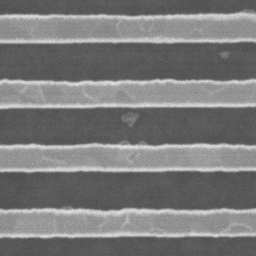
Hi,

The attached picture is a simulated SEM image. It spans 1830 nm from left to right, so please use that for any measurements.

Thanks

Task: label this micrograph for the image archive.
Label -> lines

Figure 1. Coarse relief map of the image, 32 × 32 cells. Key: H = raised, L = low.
LLLLLLLLLLLLLLLLLLLLLLLLLLLLLLLL
LLLLLLLLLLLLLLLLLLLLLLLLLLLLLLLL
HHHHHHHHHHHHHHHHHHHHHHHHHHHHHHHH
HHHHHHHHHHHHHHHHHHHHHHHHHHHHHHHH
HHHHHHHHHHHHHHHHHHHHHHHHHHHHHHHH
LLLLLLLLLLLLLLLLLLLLLLLLLLLLLLLL
LLLLLLLLLLLLLLLLLLLLLLLLLLLLLLLL
LLLLLLLLLLLLLLLLLLLLLLLLLLLLLLLL
LLLLLLLLLLLLLLLLLLLLLLLLLLLLLLLL
LLLLLLLLLLLLLLLLLLLLLLLLLLLLLLLL
HHHHHHHHHHHHHHHHHHHHHHHHHHHHHHHH
HHHHHHHHHHHHHHHHHHHHHHHHHHHHHHHH
HHHHHHHHHHHHHHHHHHHHHHHHHHHHHHHH
LLLLLLLLLLLLLLLLLLLLLLLLLLLLLLLL
LLLLLLLLLLLLLLLLLLLLLLLLLLLLLLLL
LLLLLLLLLLLLLLLLLLLLLLLLLLLLLLLL
LLLLLLLLLLLLLLLLLLLLLLLLLLLLLLLL
LLLLLLLLLLLLLLLLLLLLLLLLLLLLLLLL
HHHHHHHHHHHHHHHHHHHHHHHHHHHHHHHH
HHHHHHHHHHHHHHHHHHHHHHHHHHHHHHHH
HHHHHHHHHHHHHHHHHHHHHHHHHHHHHHHH
LLLLLLLLLLLLLLLLLLLLLLLLLLLLLLLL
LLLLLLLLLLLLLLLLLLLLLLLLLLLLLLLL
LLLLLLLLLLLLLLLLLLLLLLLLLLLLLLLL
LLLLLLLLLLLLLLLLLLLLLLLLLLLLLLLL
LLLLLLLLLLLLLLLLLLLLLLLLLLLLLLLL
HHHHHHHHHHHHHHHHHHHHHHHHHHHHHHHH
HHHHHHHHHHHHHHHHHHHHHHHHHHHHHHHH
HHHHHHHHHHHHHHHHHHHHHHHHHHHHHHHH
HHHHHHHHHHHHHHLLLLLHLHHLLLLLLLLL
LLLLLLLLLLLLLLLLLLLLLLLLLLLLLLLL
LLLLLLLLLLLLLLLLLLLLLLLLLLLLLLLL